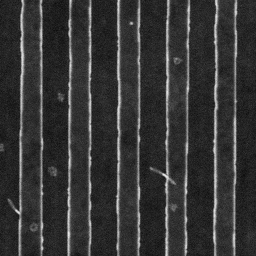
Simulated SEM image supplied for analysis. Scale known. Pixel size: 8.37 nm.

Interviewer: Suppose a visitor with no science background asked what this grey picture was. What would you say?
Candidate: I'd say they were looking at lines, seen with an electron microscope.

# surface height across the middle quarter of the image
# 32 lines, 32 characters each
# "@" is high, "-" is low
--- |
--@@@@@-------@@@@@-------@@@@@-
--@@@@@-------@@@@@-------@@@@@-
--@@@@@-------@@@@@-------@@@@@-
--@@@@--------@@@@@-------@@@@@-
--@@@@--------@@@@@-------@@@@@-
-@@@@@--------@@@@@-------@@@@@-
-@@@@@--------@@@@@-------@@@@@-
-@@@@@@-------@@@@@-------@@@@@-
-@@@@@@-------@@@@@-------@@@@@-
-@@@@@@-------@@@@@-------@@@@@-
--@@@@@-------@@@@@-------@@@@@-
-@@@@@@-------@@@@@-------@@@@@-
-@@@@@@-------@@@@@-------@@@@@-
-@@@@@@-------@@@@@-------@@@@@-
-@@@@@@-------@@@@@-------@@@@@-
-@@@@@@-------@@@@@-------@@@@@-
-@@@@@@-------@@@@@-------@@@@@-
-@@@@@@-------@@@@@-------@@@@@-
-@@@@@@-------@@@@@-------@@@@@-
-@@@@@@-------@@@@@-------@@@@@-
-@@@@@@-------@@@@@-------@@@@@-
-@@@@@@-------@@@@@-------@@@@@-
-@@@@@--------@@@@@-------@@@@@-
--@@@@--------@@@@@-------@@@@@-
-@@@@@@-------@@@@@-------@@@@@-
-@@@@@--------@@@@@-------@@@@@-
-@@@@@--------@@@@@-------@@@@@-
-@@@@@--------@@@@@-------@@@@@-
-@@@@@--------@@@@@------@@@@@@-
-@@@@@--------@@@@@-------@@@@@-
-@@@@@@-------@@@@@-------@@@@@-
-@@@@@@-------@@@@@-------@@@@@-